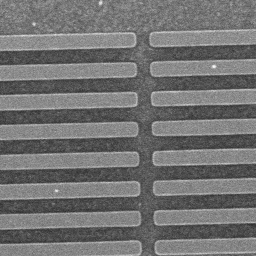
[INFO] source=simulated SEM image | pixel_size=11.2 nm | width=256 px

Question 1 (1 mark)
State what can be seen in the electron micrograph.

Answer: groups of lines, slits or small figures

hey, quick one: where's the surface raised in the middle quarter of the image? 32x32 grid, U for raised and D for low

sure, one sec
UUUUUUUUUUUUUUUUUUDDDDUUUUUUUUUU
UUUUUUUUUUUUUUUUUUDDDDUUUUUUUUUU
UUUUUUUUUUUUUUUUUUDDDDUUUUUUUUUU
UUUUDDDDDDDDDDDDDDDDDDDDDDDDDDDD
DDDDDDDDDDDDDDDDDDDDDDDDDDDDDDDD
DDDDDDDDDDDDDDDDDDDDDDDDDDDDDDDD
DDDDDDDDDDDDDDDDDDDDDDDDDDDDDDDD
DDDDUUUUUUUUUUUUUUDDDDUUUUUUUUUU
UUUUUUUUUUUUUUUUUUDDDDUUUUUUUUUU
UUUUUUUUUUUUUUUUUUDDDDUUUUUUUUUU
UUUUUUUUUUUUUUUUUUDDDDDUDDDDDDDD
DDDDDDDDDDDDDDDDDDDDDDDDDDDDDDDD
DDDDDDDDDDDDDDDDDDDDDDDDDDDDDDDD
DDDDDDDDDDDDDDDDDDDDDDDDDDDDDDDD
DDDDDDDDDDDDDDDDDDDDDDDUUUUUUUUU
UUUUUUUUUUUUUUUUUUDDDDUUUUUUUUUU
UUUUUUUUUUUUUUUUUUDDDDUUUUUUUUUU
UUUUUUUUUUUUUUUUUUDDDDUUUUUUUUUU
UUUDDDDDDDDDDDDDDDDDDDDDDDDDDDDD
DDDDDDDDDDDDDDDDDDDDDDDDDDDDDDDD
DDDDDDDDDDDDDDDDDDDDDDDDDDDDDDDD
DDDDDDDDDDDDDDDDDDDDDDDDDDDDDDDD
UUUUUUUUUUUUUUUUUUUDDDUUUUUUUUUU
UUUUUUUUUUUUUUUUUUUDDDUUUUUUUUUU
UUUUUUUUUUUUUUUUUUUDDDUUUUUUUUUU
UUUUUUUUUUUUUUUUDDDDDDDDDDDDDDDD
DDDDDDDDDDDDDDDDDDDDDDDDDDDDDDDD
DDDDDDDDDDDDDDDDDDDDDDDDDDDDDDDD
DDDDDDDDDDDDDDDDDDDDDDDDDDDDDDDD
DDDDDDDDDDDDDDDDDDDDDDDUUUUUUUUU
UUUUUUUUUUUUUUUUUUUDDDUUUUUUUUUU
UUUUUUUUUUUUUUUUUUUDDDUUUUUUUUUU